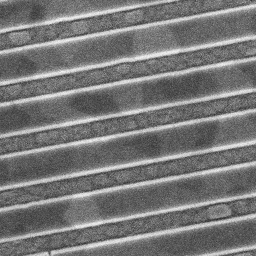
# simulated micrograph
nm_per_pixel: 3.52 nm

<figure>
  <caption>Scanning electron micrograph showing parallel lines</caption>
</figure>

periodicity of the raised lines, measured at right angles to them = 182 nm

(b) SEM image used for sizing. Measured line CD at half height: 112 nanometres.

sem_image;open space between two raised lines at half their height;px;20.3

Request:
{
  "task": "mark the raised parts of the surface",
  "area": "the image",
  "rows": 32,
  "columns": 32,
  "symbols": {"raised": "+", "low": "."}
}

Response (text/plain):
+++++++++++++++++++.............
++++++++++++++..............++++
++++++++..............++++++++++
+++.............++++++++++++++++
...........+++++++++++++++++++++
......+++++++++++++++++++++.....
++++++++++++++++++++++..........
++++++++++++++++..............++
+++++++++++..............+++++++
+++++...............++++++++++++
..............++++++++++++++++++
.........++++++++++++++++++++++.
...++++++++++++++++++++++.......
++++++++++++++++++++............
++++++++++++++..............++++
+++++++++.............++++++++++
+++..............+++++++++++++++
...........+++++++++++++++++++++
......++++++++++++++++++++++....
++++++++++++++++++++++..........
+++++++++++++++++..............+
++++++++++++..............++++++
++++++..............++++++++++++
+..............+++++++++++++++++
.........++++++++++++++++++++++.
....++++++++++++++++++++++......
++++++++++++++++++++............
+++++++++++++++..............+++
+++++++++..............+++++++++
++++..............++++++++++++++
............++++++++++++++++++++
.......++++++++++++++++++++++...